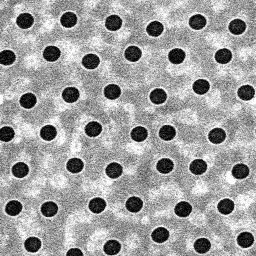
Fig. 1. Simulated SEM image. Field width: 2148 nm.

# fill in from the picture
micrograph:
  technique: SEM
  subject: a regular array of holes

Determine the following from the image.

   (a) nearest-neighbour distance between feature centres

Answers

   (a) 314 nanometres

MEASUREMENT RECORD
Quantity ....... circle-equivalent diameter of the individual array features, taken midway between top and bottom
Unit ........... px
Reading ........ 17.3